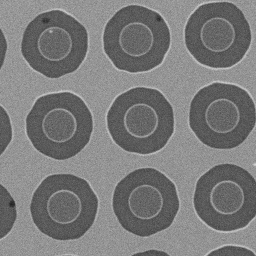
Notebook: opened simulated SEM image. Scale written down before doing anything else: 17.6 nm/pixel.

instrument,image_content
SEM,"an array of small figures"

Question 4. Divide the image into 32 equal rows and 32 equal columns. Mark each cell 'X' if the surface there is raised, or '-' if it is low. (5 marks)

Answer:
XXXXXXXXXXXXXXXXXXXXXXXXX----XXX
XXXXXX--XXXXXXX-----XXXX------XX
XXXX------XXXX-------XX---XX---X
XXX---X----XX---XX---XX--XXXX--X
-XX--XXXX--XX--XXXX--XX--XXXX--X
-XX--XXXX--XX--XXXX--XX---XXX--X
-XX--XXXX--XX---XX---XXX-------X
-XX---X----XXX------XXXX------XX
XXXX------XXXXX----XXXXXXX--XXXX
XXXXXX--XXXXXXXXXXXXXXXXXXXXXXXX
XXXXXXXXXXXXXXXXXXXXXXXXXX---XXX
XXXXXXX--XXXXXXX----XXXXX------X
XXXXX-----XXXX-------XXX--------
XXXX-------XXX--XXX---XX--XXXX--
-XX---XXX---X---XXXX--XX--XXXX--
-XX--XXXX---X---XXXX--XX--XXXX--
--X---XXX---XX--XXX---XX-------X
-XXX--XX---XXX-------XXXX------X
-XXX------XXXXX-----XXXXXXX--XXX
XXXXXX---XXXXXXXXXXXXXXXXXXXXXXX
XXXXXXXXXXXXXXXXXXXXXXXXXXXX-XXX
XXXXXXXXXXXXXXXX----XXXXXX-----X
XXXXX------XXXX------XXXX-------
-XXXX------XXX---XX---XX---XXX--
-XXX---XXX--XX--XXXX--XX--XXXX--
--XX--XXXX--XX--XXXX--XX---XXX--
--XX--XXXX--XX---XXX--XX----X---
--XX---XX---XXX-------XXX-------
-XXXX------XXXX------XXXXX----XX
-XXXXX----XXXXXXX--XXXXXXXXXXXXX
XXXXXXXXXXXXXXXXXXXXXXXXXXXXXXXX
XXXXXXXXXXXXXXXXXX---XXXXX------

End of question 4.